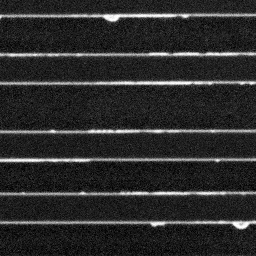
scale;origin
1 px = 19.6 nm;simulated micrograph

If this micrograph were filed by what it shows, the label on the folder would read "lines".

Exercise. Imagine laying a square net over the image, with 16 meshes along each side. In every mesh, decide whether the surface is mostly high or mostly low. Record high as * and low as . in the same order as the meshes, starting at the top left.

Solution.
****************
................
................
****************
****************
................
................
................
****************
****************
................
................
****************
****************
................
................